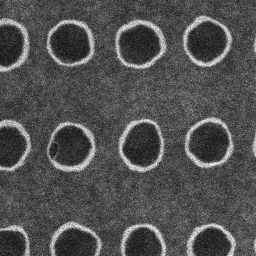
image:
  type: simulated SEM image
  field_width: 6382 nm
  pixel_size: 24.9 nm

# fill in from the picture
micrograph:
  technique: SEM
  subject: raised bodies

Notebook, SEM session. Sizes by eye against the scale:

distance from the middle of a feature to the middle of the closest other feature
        1690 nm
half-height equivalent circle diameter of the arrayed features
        1120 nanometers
